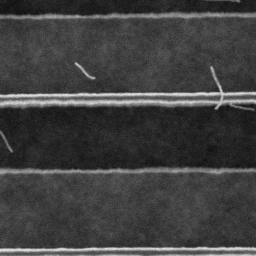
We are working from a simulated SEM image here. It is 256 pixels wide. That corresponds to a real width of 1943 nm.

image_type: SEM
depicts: lines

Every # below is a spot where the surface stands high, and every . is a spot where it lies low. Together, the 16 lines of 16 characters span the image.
................
################
################
################
################
################
######.......#..
................
................
................
................
################
################
################
################
################